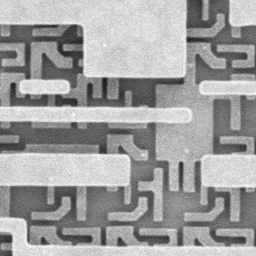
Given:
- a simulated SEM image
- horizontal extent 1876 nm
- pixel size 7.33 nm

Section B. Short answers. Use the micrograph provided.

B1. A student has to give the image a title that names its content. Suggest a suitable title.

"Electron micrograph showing wiring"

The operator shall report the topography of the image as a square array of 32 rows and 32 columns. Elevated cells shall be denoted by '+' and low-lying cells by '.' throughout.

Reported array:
+++++++++++++++++++++++......+++
+++++++++++++++++++++++......+++
+++++++++++++++++++++++......+++
..........+++++++++++++.........
...........++++++++++++.........
...........++++++++++++.........
...........++++++++++++.........
...........++++++++++++.........
..........+++++++++++++.........
...........++++++++++++.........
..+++++++................+++++++
...+++++.................+++++++
................................
+++++++++++++++++++.............
++++++++++++++++++++++++........
................................
................................
................................
................................
++++++++++++++++..........++++++
++++++++++++++++.........+++++++
++++++++++++++++.........+++++++
++++++++++++++++.........+++++++
................................
................................
................................
................................
+++.............................
+++.............................
..+.............................
..++............................
..++++++++++++++++++++++++++++++